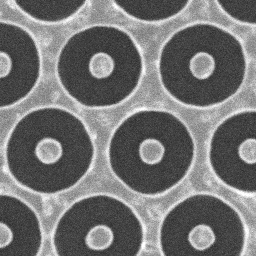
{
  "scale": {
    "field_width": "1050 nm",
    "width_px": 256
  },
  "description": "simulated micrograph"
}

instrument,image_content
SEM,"ring-shaped grooves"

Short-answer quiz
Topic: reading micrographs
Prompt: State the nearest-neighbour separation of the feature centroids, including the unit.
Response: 405 nm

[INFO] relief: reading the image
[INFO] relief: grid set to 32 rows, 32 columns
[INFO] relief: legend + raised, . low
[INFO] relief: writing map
++........+++++........++++.....
+++.......++++++......++++++....
+++++...+++++++++....+++++++++..
...++++++++...+++++++++.....++++
....+++++.......++++++.......+++
....++++.........++++.........++
.....+++.........+++...........+
+....++....+++....++....+++....+
+....++....+++....++....+++....+
.....++.....+.....++....++.....+
....++++.........+++..........++
....++++.........++++........+++
...+++++++.....+++++++......++++
++++++..++++++++++++++++++++++++
+++......+++++++......+++++++...
++........+++++........+++++....
+..........+++..........+++.....
+....++....+++..........++.....+
+....+++....++...+++....++....++
+....+++....++....++....++....++
+..........+++..........++......
+..........+++..........+++.....
++........+++++........+++++....
+++......+++++++.....++++++++...
.+++++++++++..++++++++++..++++++
...++++++.......++++++......++++
....++++.........++++.........++
.....++..........+++..........++
+....++.....++....++....++.....+
+....++....+++....++....+++....+
+....++....+++....++....++....++
.....++..........+++..........++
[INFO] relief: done